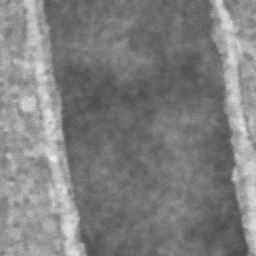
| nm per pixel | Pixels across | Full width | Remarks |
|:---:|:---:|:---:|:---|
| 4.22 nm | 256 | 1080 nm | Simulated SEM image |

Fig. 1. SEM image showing one or a few lines or trenches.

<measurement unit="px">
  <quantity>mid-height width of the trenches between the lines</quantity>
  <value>189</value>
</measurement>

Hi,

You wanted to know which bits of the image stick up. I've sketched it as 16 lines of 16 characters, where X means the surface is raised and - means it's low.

XX------------XX
XX------------XX
XX------------XX
XX------------XX
XXX------------X
XXX------------X
XXX------------X
XXX------------X
XXX------------X
XXX------------X
XXX-------------
XXXX------------
XXXX------------
XXXX------------
XXXX------------
XXXXX-----------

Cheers